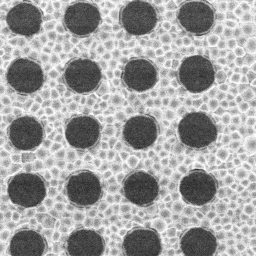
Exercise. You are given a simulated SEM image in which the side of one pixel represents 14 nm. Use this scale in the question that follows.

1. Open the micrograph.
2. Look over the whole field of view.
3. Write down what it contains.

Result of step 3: a regular array of raised bodies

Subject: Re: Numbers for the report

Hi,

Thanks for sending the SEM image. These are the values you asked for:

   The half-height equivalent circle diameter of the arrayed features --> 0.517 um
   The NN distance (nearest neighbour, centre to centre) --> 796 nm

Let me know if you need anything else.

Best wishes